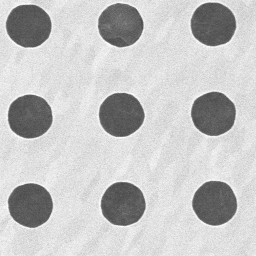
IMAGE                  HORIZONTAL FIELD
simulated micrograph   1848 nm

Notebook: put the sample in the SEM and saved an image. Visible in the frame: a regular array of holes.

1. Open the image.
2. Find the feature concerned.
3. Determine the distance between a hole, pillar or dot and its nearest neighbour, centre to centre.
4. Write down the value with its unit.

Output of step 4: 644 nanometres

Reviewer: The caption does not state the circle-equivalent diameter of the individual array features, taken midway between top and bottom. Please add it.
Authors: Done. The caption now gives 323 nanometers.